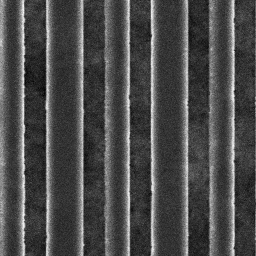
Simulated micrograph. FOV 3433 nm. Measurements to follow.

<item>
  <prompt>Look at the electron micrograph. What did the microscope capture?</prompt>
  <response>lines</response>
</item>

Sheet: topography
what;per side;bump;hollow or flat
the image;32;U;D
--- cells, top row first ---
UUUDDDUUUUDDDUUUDDDUUUUDDDUUUDDD
UUUDDDUUUUDDDUUUDDDUUUUDDDUUUDDD
UUUDDDUUUUDDDUUUDDDUUUUDDDUUUDDD
UUUDDDUUUUDDDUUUDDDUUUUDDDUUUDDD
UUUDDDUUUUDDDUUUDDDUUUUDDDUUUDDD
UUUDDDUUUUDDDUUUDDDUUUUDDDUUUDDD
UUUDDDUUUUDDDUUUDDDUUUUDDDUUUDDD
UUUDDDUUUUDDDUUUDDDUUUUDDDUUUDDD
UUUDDDUUUUDDDUUUDDDUUUUDDDUUUDDD
UUUDDDUUUUDDDUUUDDDUUUUDDDUUUDDD
UUUDDDUUUUDDDUUUDDDUUUUDDDUUUDDD
UUUDDDUUUUDDDUUUDDDUUUUDDDUUUDDD
UUUDDDUUUUDDDUUUDDDUUUUDDDUUUDDD
UUUDDDUUUUDDDUUUDDDUUUUDDDUUUDDD
UUUDDDUUUUDDDUUUDDDUUUUDDDUUUDDD
UUUDDDUUUUDDDUUUDDDUUUUDDDUUUDDD
UUUDDDUUUUDDDUUUDDDUUUUDDDUUUDDD
UUUDDDUUUUDDDUUUDDDUUUUDDDUUUDDD
UUUDDDUUUUDDDUUUDDDUUUUDDDUUUDDD
UUUDDDUUUUDDDUUUDDDUUUUDDDUUUDDD
UUUDDDUUUUDDDUUUDDDUUUUDDDUUUDDD
UUUDDDUUUUDDDUUUDDDUUUUDDDUUUDDD
UUUDDDUUUUDDDUUUDDDUUUUDDDUUUDDD
UUUDDDUUUUDDDUUUDDDUUUUDDDUUUDDD
UUUDDDUUUUDDDUUUDDDUUUUDDDUUUDDD
UUUDDDUUUUDDDUUUDDDUUUUDDDUUUDDD
UUUDDDUUUUDDDUUUDDDUUUUDDDUUUDDD
UUUDDDUUUUDDDUUUDDDUUUUDDDUUUDDD
UUUDDDUUUUDDDUUUDDDUUUUDDDUUUDDD
UUUDDDUUUUDDDUUUDDDUUUUDDDUUUDDD
UUUDDDUUUUDDDUUUDDDUUUUDDDUUUDDD
UUUDDDUUUUDDDUUUDDDUUUUDDDUUUDDD